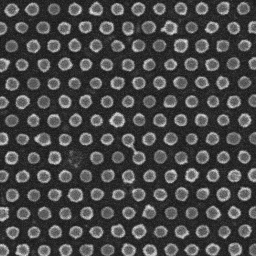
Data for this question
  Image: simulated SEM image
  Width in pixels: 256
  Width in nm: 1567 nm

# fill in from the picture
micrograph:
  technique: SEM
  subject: a regular array of raised bodies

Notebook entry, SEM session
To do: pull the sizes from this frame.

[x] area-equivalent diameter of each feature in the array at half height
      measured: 76.2 nanometres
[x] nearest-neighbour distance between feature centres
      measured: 126 nm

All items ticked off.